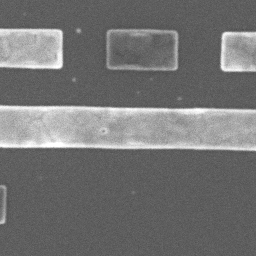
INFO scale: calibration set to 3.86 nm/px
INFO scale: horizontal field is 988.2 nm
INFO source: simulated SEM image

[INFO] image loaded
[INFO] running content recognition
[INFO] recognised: wiring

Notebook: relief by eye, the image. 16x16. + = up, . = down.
................
................
++++...++++...++
++++...++++...++
................
................
................
++++++++++++++++
++++++++++++++++
................
................
................
................
................
................
................